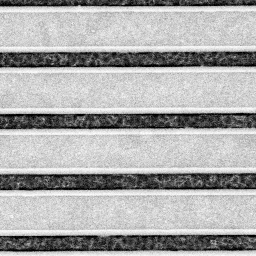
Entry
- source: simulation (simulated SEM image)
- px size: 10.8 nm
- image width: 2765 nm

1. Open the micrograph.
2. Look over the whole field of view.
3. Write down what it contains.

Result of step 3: one or a few lines or trenches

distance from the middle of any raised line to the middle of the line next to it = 660 nm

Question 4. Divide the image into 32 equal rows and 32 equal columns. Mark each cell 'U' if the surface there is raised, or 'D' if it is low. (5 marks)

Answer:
DDDDDDDDDDDDDDDDDDDDDDDDDDDDDDDD
UUUUUUUUUUUUUUUUUUUUUUUUUUUUUUUU
UUUUUUUUUUUUUUUUUUUUUUUUUUUUUUUU
UUUUUUUUUUUUUUUUUUUUUUUUUUUUUUUU
UUUUUUUUUUUUUUUUUUUUUUUUUUUUUUUU
UUUUUUUUUUUUUUUUUUUUUUUUUUUUUUUU
DDDDDDDDDDDDDDDDDDDDDDDDDDDDDDDD
DDDDDDDDDDDDDDDDDDDDDDDDDDDDDDDD
DDDDDDDDDDDDDDDDDDDDDDDDDDDDDDDD
UUUUUUUUUUUUUUUUUUUUUUUUUUUUUUUU
UUUUUUUUUUUUUUUUUUUUUUUUUUUUUUUU
UUUUUUUUUUUUUUUUUUUUUUUUUUUUUUUU
UUUUUUUUUUUUUUUUUUUUUUUUUUUUUUUU
UUUUUUUUUUUUUUUUUUUUUUUUUUUUUUUU
DDDDDDDDDDDDDDDDDDDDDDDDDDDDDDDD
DDDDDDDDDDDDDDDDDDDDDDDDDDDDDDDD
UDDUUUUUUUUUUUUUUUUUUUUUUUUUUUUU
UUUUUUUUUUUUUUUUUUUUUUUUUUUUUUUU
UUUUUUUUUUUUUUUUUUUUUUUUUUUUUUUU
UUUUUUUUUUUUUUUUUUUUUUUUUUUUUUUU
UUUUUUUUUUUUUUUUUUUUUUUUUUUUUUUU
DDDDDDDDDDDDDDDDDDDDDDDDDDDDDDDD
DDDDDDDDDDDDDDDDDDDDDDDDDDDDDDDD
DDDDDDDDDDDDDDDDDDDDDDDDDDDDDDDD
UUUUUUUUUUUUUUUUUUUUUUUUUUUUUUUU
UUUUUUUUUUUUUUUUUUUUUUUUUUUUUUUU
UUUUUUUUUUUUUUUUUUUUUUUUUUUUUUUU
UUUUUUUUUUUUUUUUUUUUUUUUUUUUUUUU
UUUUUUUUUUUUUUUUUUUUUUUUUUUUUUUU
DDDDDDDDDDDDDDDDDDDDDDDDDDDDDDDD
DDDDDDDDDDDDDDDDDDDDDDDDDDDDDDDD
DDDDDDDDDDDDDDDDDDDDDDDDDDDDDDDD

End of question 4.